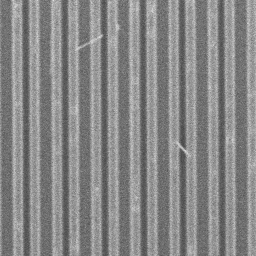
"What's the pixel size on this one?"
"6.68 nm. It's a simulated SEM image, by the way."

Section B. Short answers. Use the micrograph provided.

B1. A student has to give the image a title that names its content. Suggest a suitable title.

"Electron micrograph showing parallel lines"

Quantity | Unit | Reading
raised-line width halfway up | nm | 60.1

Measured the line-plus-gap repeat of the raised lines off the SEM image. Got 0.129 um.